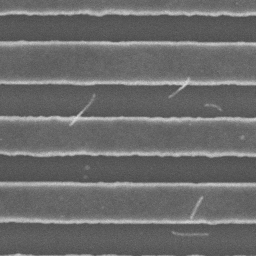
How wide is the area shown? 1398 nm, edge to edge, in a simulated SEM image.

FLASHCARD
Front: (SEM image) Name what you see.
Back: lines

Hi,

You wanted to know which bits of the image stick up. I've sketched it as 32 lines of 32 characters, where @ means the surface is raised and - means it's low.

@@@@@@@@@@@@@@@@@@@@@@@@@@@@@@@@
@@@@@@@@@@@@@@@@@@@@@@@@@@@@@@@@
--------------------------------
--------------------------------
--------------------------------
@@@@@@@@@@@@@@@@@@@@@@@@@@@@@@@@
@@@@@@@@@@@@@@@@@@@@@@@@@@@@@@@@
@@@@@@@@@@@@@@@@@@@@@@@@@@@@@@@@
@@@@@@@@@@@@@@@@@@@@@@@@@@@@@@@@
@@@@@@@@@@@@@@@@@@@@@@@@@@@@@@@@
---------@@@----@-@@-@@@@@@@-@@@
--------------------------------
--------------------------------
--------------------------------
---------@----------------------
@@@@@@@@@@@@@@@@@@@@@@@@@@@@@@@@
@@@@@@@@@@@@@@@@@@@@@@@@@@@@@@@@
@@@@@@@@@@@@@@@@@@@@@@@@@@@@@@@@
@@@@@@@@@@@@@@@@@@@@@@@@@@@@@@@@
----@@----------------@---@@-@@@
--------------------------------
--------------------------------
--------------------------------
@@@@@@@@@@@@@@@@@@@@@@@@@@@@@@@@
@@@@@@@@@@@@@@@@@@@@@@@@@@@@@@@@
@@@@@@@@@@@@@@@@@@@@@@@@@@@@@@@@
@@@@@@@@@@@@@@@@@@@@@@@@@@@@@@@@
@@@@@@@@@@@@@@@@@@@@@@@@@@@@@@@@
--------------------------------
--------------------------------
--------------------------------
--------------------------------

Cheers